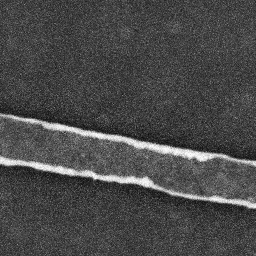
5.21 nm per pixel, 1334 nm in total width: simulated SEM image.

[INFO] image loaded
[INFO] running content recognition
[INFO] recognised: one or a few lines or trenches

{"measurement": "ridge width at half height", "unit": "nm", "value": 235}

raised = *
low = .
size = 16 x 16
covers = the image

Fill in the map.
................
................
................
................
................
................
................
**..............
*******.........
************....
..**************
.........*******
.............***
................
................
................